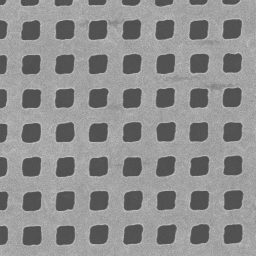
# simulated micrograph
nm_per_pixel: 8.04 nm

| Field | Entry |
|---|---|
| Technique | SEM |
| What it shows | a regular array of holes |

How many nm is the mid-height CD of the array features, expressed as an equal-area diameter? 164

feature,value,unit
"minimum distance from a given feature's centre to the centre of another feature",0.267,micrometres